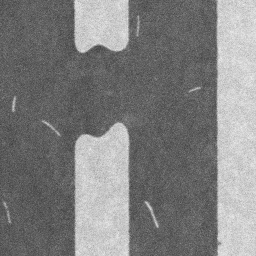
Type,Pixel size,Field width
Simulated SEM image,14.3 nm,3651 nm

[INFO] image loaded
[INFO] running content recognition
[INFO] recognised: one or a few lines or trenches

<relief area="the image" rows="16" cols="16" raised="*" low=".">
.....***......**
.....***......**
.....***......**
..............**
..............**
..............**
..............**
..............**
.....***......**
.....***......**
.....***......**
.....***......**
.....***......**
.....***......**
.....***......**
.....***......**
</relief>